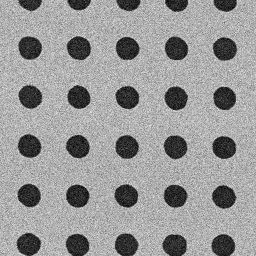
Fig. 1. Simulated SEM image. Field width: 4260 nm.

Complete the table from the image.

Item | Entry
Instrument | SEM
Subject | a regular array of holes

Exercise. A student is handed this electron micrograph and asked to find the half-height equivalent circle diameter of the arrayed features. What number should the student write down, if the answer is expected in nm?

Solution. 390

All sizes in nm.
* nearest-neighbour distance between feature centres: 808